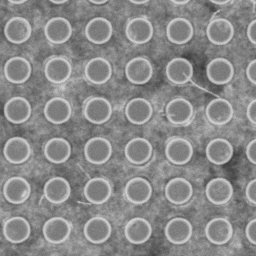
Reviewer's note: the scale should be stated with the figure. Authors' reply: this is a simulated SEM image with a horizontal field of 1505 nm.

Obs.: a regular array of raised bodies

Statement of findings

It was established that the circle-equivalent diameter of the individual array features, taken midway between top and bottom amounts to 25.2 px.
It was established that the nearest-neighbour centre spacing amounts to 234 nanometres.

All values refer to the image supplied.